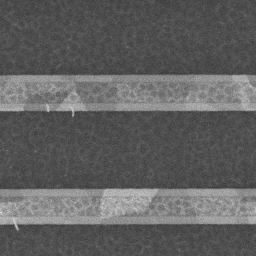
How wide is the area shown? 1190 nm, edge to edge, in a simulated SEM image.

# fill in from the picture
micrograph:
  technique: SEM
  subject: one or a few lines or trenches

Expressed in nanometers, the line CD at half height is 129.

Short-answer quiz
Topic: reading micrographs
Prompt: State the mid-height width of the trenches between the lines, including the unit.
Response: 401 nm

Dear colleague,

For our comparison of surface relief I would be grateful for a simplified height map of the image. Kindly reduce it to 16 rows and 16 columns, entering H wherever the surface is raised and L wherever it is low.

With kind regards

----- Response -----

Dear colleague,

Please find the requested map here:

LLLLLLLLLLLLLLLL
LLLLLLLLLLLLLLLL
LLLLLLLLLLLLLLLL
LLLLLLLLLLLLLLLL
LLLLLLLLLLLLLLLL
HHHHHHHHHHHHHHHH
HHHHHHHHHHHHHHHH
LLLLLLLLLLLLLLLL
LLLLLLLLLLLLLLLL
LLLLLLLLLLLLLLLL
LLLLLLLLLLLLLLLL
LLLLLLLLLLLLLLLL
HHHHHHHHHHHHHHHH
HHHHHHHHHHHHHHHH
LLLLLLLLLLLLLLLL
LLLLLLLLLLLLLLLL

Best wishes